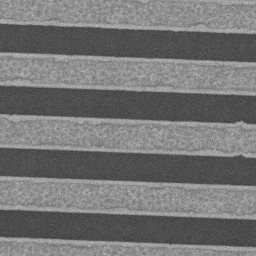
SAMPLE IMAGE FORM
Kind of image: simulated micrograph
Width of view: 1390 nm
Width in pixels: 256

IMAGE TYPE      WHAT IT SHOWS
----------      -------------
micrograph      one or a few lines or trenches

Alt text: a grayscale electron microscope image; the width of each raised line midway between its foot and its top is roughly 163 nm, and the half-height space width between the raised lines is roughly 0.173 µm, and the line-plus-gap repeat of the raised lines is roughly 336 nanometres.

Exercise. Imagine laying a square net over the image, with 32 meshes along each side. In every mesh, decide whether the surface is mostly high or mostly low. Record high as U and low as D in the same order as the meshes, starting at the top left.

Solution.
UUUUUUUUUUUUUUUUUUUUUUUUUUUUUUUU
UUUUUUUUUUUUUUUUUUUUUUUUUUUUUUUU
UUUUUUUUUUUUUUUUUUUUUUUUUUUUUUUU
DDDDDDDDDDDDDDDDDDDDUUUUUUUUUUUU
DDDDDDDDDDDDDDDDDDDDDDDDDDDDDDDD
DDDDDDDDDDDDDDDDDDDDDDDDDDDDDDDD
DDDDDDDDDDDDDDDDDDDDDDDDDDDDDDDD
UUUUUUUUUUUUUUUUUUDDDDDDDDDDDDDD
UUUUUUUUUUUUUUUUUUUUUUUUUUUUUUUU
UUUUUUUUUUUUUUUUUUUUUUUUUUUUUUUU
DUUUUUUUUUUUUUUUUUUUUUUUUUUUUUUU
DDDDDDDDDDDDDDDDDDDDDDDDDDUUUUUU
DDDDDDDDDDDDDDDDDDDDDDDDDDDDDDDD
DDDDDDDDDDDDDDDDDDDDDDDDDDDDDDDD
DDDDDDDDDDDDDDDDDDDDDDDDDDDDDDDD
UUUUUUUUUUUUUUUUUUUUUUUUDDDDDDDD
UUUUUUUUUUUUUUUUUUUUUUUUUUUUUUUU
UUUUUUUUUUUUUUUUUUUUUUUUUUUUUUUU
DDDDDDDDUUUUUUUUUUUUUUUUUUUUUUUU
DDDDDDDDDDDDDDDDDDDDDDDDDDDDDDDD
DDDDDDDDDDDDDDDDDDDDDDDDDDDDDDDD
DDDDDDDDDDDDDDDDDDDDDDDDDDDDDDDD
UUUUUUDDDDDDDDDDDDDDDDDDDDDDDDDD
UUUUUUUUUUUUUUUUUUUUUUUUUUUUUUUD
UUUUUUUUUUUUUUUUUUUUUUUUUUUUUUUU
UUUUUUUUUUUUUUUUUUUUUUUUUUUUUUUU
DDDDDDDDDDDDDDUUUUUUUUUUUUUUUUUU
DDDDDDDDDDDDDDDDDDDDDDDDDDDDDDDD
DDDDDDDDDDDDDDDDDDDDDDDDDDDDDDDD
DDDDDDDDDDDDDDDDDDDDDDDDDDDDDDDD
UUUUUUUUUUUUUUUUDDDDDDDDDDDDDDDD
UUUUUUUUUUUUUUUUUUUUUUUUUUUUUUUU